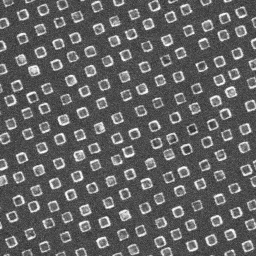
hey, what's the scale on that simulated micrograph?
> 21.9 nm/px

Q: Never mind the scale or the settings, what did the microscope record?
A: a regular array of raised bodies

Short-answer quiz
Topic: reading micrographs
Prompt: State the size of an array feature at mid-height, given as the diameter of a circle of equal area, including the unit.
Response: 0.22 µm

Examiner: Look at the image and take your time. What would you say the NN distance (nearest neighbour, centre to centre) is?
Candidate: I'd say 402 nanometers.